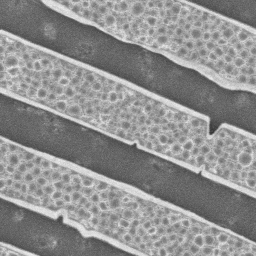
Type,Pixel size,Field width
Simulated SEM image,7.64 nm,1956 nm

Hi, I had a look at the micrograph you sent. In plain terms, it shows one or a few lines or trenches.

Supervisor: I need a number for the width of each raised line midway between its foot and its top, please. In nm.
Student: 410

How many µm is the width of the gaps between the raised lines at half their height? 0.333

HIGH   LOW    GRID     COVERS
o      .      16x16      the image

....ooooooooo...
......ooooooooo.
o.......oooooooo
oooo......oooooo
oooooo.......ooo
oooooooo.......o
..ooooooooo.....
.....oooooooo...
.......ooooooooo
oo........oooooo
ooooo.......oooo
ooooooo.......oo
.ooooooooo......
....oooooooo....
.....ooooooooo..
o.......oooooooo